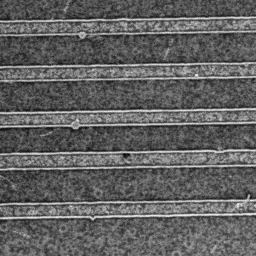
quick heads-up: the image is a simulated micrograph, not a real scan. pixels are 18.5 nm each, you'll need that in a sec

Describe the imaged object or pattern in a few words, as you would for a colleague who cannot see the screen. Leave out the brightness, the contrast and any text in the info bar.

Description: parallel lines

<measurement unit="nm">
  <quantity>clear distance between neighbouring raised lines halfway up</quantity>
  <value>594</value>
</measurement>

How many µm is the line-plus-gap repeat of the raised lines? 0.843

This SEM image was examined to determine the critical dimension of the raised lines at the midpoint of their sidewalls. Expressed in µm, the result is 0.249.